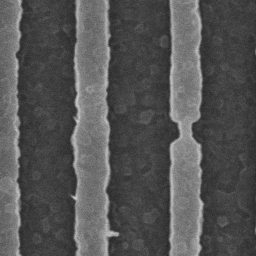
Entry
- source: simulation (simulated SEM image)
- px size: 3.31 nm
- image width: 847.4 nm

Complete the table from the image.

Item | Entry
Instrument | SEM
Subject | one or a few lines or trenches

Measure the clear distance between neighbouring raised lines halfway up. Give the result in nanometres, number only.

202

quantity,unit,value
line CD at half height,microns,0.0996